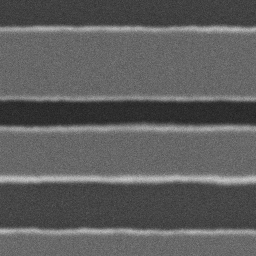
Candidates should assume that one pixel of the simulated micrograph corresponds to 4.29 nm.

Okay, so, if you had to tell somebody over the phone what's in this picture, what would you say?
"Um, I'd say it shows lines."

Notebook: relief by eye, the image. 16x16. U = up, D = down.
DDDDDDDDDDDDDDDD
DDDDDDDDDDDDDDDD
UUUUUUUUUUUUUUUU
UUUUUUUUUUUUUUUU
UUUUUUUUUUUUUUUU
UUUUUUUUUUUUUUUU
DDDDDDDDDDDDDDDD
DDDDDDDDDDDDDDDD
UUUUUUUUUUUUUUUU
UUUUUUUUUUUUUUUU
UUUUUUUUUUUUUUUU
DDDDDDDDDDDDDDDD
DDDDDDDDDDDDDDDD
DDDDDDDDDDDDDDDD
UUUUUUUUUUUUUUUU
UUUUUUUUUUUUUUUU